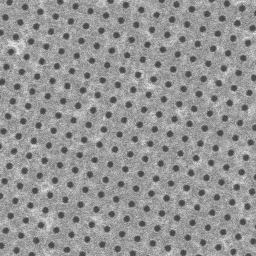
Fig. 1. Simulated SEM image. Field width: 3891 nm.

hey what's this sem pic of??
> a regular array of holes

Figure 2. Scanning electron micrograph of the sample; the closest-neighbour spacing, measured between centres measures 236 nm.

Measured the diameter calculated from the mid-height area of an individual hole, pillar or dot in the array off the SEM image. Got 106 nanometres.